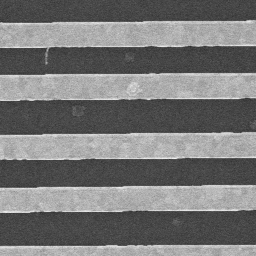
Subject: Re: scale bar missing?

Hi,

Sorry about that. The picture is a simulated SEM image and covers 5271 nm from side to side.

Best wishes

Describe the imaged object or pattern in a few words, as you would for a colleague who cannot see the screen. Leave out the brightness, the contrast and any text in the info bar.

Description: lines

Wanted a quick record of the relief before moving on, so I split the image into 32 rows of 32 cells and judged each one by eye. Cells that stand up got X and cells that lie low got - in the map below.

--------------------------------
--------------------------------
--------------------------------
XXXXXXXXXXXXXXXXXXXXXXXXXXXXXXXX
XXXXXXXXXXXXXXXXXXXXXXXXXXXXXXXX
XXXXXXXXXXXXXXXXXXXXXXXXXXXXXXXX
--------------------------------
--------------------------------
--------------------------------
--XXXXXXXXXXXXXXXXXXXXXXXXXXXXXX
XXXXXXXXXXXXXXXXXXXXXXXXXXXXXXXX
XXXXXXXXXXXXXXXXXXXXXXXXXXXXXXXX
--------------------------------
--------------------------------
--------------------------------
--------------------------------
--------------------------------
XXXXXXXXXXXXXXXXXXXXXXXXXXXXXXXX
XXXXXXXXXXXXXXXXXXXXXXXXXXXXXXXX
XXXXXXXXXXXXXXXXXXXXXXXXXXXXXXXX
--------------------------------
--------------------------------
--------------------------------
----------XXXXXXXXXXXXXXXXXXXXXX
XXXXXXXXXXXXXXXXXXXXXXXXXXXXXXXX
XXXXXXXXXXXXXXXXXXXXXXXXXXXXXXXX
--------------------------------
--------------------------------
--------------------------------
--------------------------------
--------------------------------
XXXXXXXXXXXXXXXXXXXXXXXXXXXXXXXX